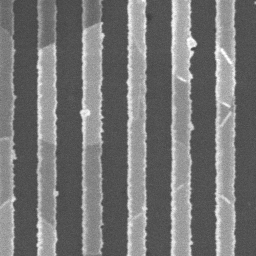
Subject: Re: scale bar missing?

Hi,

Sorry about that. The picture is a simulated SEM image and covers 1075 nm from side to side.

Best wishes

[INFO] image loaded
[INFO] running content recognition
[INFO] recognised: lines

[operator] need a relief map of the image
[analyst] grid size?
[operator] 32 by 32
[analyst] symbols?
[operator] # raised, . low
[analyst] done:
##...##...###...##....##...##...
##...##...###...##....##...##...
##...##...###...##....##...##...
##...##...###...##....##...##...
##...##...###...##....##...##...
##...##...###...##....##...##...
##...##...###...##....##...##...
##...##...###...##....##...##...
##...##...###...##....##...##...
##...##...###...##....##...##...
##...##...###...##....##...##...
##...##...###...##....##...##...
##...##...###...##....##...##...
##...##...###...##....##...##...
##...##...###...##....##...##...
##...##...###...##....##...##...
##...##...###...##...###...##...
##...##...###...##....##...##...
##...##...###...##....##...##...
##...##...###...##....##...##...
##...##...###...##....##...##...
##...##...###...##....##...##...
##...##...###...##....##...##...
##...##...###...##...###...##...
##...##...###...##...###...##...
##...##...###...##...###...##...
##...##...###...##...###...##...
##...##...###...##...###...##...
##...##...###...##....##...##...
##...##...###...##...###...##...
##...##...###...##....##...##...
##...##...###...##...###...##...